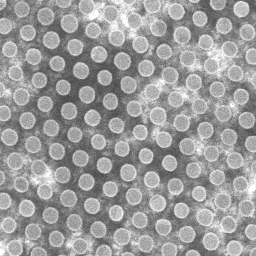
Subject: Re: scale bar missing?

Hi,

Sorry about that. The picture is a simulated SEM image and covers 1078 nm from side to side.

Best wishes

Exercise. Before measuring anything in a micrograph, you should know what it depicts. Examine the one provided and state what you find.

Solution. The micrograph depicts a regular array of raised bodies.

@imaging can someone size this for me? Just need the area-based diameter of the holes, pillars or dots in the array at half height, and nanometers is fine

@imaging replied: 65.6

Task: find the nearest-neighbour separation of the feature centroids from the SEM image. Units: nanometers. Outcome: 102